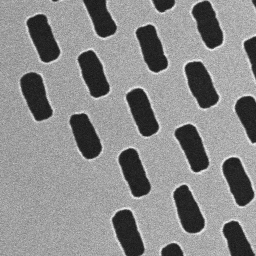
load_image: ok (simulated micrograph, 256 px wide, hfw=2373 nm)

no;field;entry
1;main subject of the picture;a regular array of holes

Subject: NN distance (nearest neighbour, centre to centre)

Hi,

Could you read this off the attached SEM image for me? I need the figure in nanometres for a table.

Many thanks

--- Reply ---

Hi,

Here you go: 563